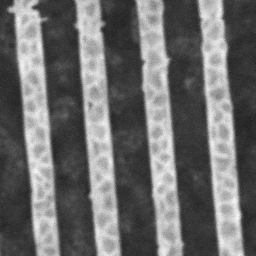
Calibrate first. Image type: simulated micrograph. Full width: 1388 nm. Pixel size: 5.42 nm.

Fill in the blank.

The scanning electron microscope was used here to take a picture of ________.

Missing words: one or a few lines or trenches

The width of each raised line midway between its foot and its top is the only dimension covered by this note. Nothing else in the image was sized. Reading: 120 nanometres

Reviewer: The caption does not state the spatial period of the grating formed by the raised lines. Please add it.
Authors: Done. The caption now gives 331 nm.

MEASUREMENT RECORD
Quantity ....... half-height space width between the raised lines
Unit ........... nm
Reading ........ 213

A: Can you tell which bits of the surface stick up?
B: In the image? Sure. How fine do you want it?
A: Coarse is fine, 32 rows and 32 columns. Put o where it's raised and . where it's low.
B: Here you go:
..oo......oo.....ooo.....ooo....
..ooo.....oo.....ooo.....ooo....
..ooo.....ooo....ooo.....ooo....
..ooo.....ooo.....oo.....ooo....
..ooo.....ooo.....oo.....ooo....
..ooo.....ooo.....oo.....ooo....
..ooo.....ooo.....ooo....ooo....
..ooo.....ooo.....ooo.....oo....
...oo.....ooo.....ooo.....oo....
...ooo....ooo.....ooo.....oo....
...ooo....ooo.....ooo.....ooo...
...ooo.....oo.....ooo.....ooo...
...ooo.....oo.....ooo.....ooo...
...ooo.....oo.....ooo.....ooo...
...ooo.....oo......oo.....ooo...
...ooo.....ooo.....oo.....ooo...
...ooo.....ooo.....oo.....ooo...
...ooo.....ooo.....oo.....ooo...
...ooo.....ooo.....oo.....ooo...
....oo.....ooo.....ooo....ooo...
....oo.....ooo.....ooo.....oo...
....oo.....ooo.....ooo.....oo...
....ooo....ooo.....ooo.....ooo..
....ooo.....oo.....ooo.....ooo..
....ooo....ooo.....ooo.....ooo..
....ooo.....oo.....ooo.....ooo..
....ooo.....oo......oo.....ooo..
....ooo.....ooo.....oo.....ooo..
....ooo.....ooo.....oo.....ooo..
.....oo.....ooo.....oo.....ooo..
.....oo.....ooo.....ooo....ooo..
.....oo.....ooo.....ooo.....oo..